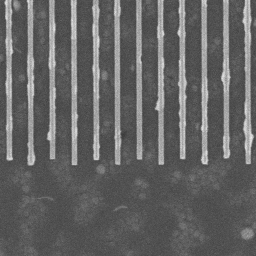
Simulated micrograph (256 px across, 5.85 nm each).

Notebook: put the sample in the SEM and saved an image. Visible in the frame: parallel lines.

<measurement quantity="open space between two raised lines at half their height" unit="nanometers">95.8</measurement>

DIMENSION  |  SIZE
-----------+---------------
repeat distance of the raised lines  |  127 nm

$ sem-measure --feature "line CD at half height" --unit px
5.25